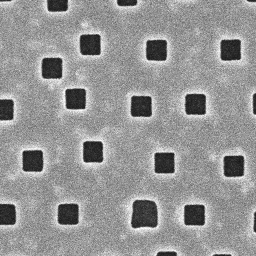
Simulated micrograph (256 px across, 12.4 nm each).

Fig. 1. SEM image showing a regular array of holes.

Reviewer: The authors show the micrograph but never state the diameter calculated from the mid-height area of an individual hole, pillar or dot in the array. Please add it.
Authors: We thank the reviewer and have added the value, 297 nanometers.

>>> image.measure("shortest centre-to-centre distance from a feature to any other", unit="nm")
680